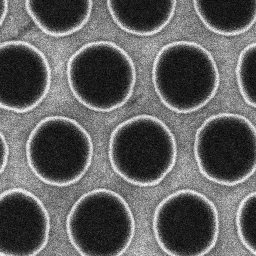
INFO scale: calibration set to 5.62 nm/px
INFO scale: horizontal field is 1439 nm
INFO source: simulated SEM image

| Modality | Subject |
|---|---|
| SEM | raised bodies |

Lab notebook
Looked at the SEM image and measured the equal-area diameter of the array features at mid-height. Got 377 nm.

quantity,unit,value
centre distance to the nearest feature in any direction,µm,0.469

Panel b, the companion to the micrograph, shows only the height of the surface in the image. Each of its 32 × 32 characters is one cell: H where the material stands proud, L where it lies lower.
HLLHHHHHHHHLLHHHHHHHHHLLHHHHHHHH
HLLLHHHHHHHLLLHHHHHHHHLLLHHHHHHH
LLLLHHHHHHHLLLHHHHHHHLLLLHHHHHHH
LLLLLHHHHHLLLLLHHHHHLLLLLLHHHHHL
LLLLLLLLLLLLLLLLLLLLLLLLLLLLLLLL
LHHLLLLLLLLHHHLLLLLLLLHHLLLLLLLL
HHHHHLLLLLHHHHHLLLLLHHHHHHLLLLHH
HHHHHHLLLHHHHHHHLLLLHHHHHHHLLLHH
HHHHHHLLLHHHHHHHHLLHHHHHHHHLLLHH
HHHHHHLLLHHHHHHHHLLHHHHHHHHLLLHH
HHHHHHLLLHHHHHHHHLLHHHHHHHHLLLHH
HHHHHHLLLHHHHHHHLLLLHHHHHHHLLLHH
HHHHHLLLLLHHHHHHLLLLHHHHHHLLLLLH
LHHHLLLLLLLHHHLLLLLLLHHHHLLLLLLL
LLLLLLLLLLLLLLLLLLLLLLLLLLLHHHLL
LLLLLHHHHHLLLLLHHHHHLLLLLLHHHHHL
LLLLHHHHHHHLLLHHHHHHHLLLLHHHHHHH
HLLLHHHHHHHLLLHHHHHHHHLLLHHHHHHH
HLLLHHHHHHHLLLHHHHHHHHLLHHHHHHHH
HLLLHHHHHHHLLLHHHHHHHHLLLHHHHHHH
HLLLHHHHHHHLLLHHHHHHHHLLLHHHHHHH
LLLLHHHHHHHLLLLHHHHHHLLLLHHHHHHH
LLLLLHHHHLLLLLLLHHHHLLLLLLLHHHLL
LLLLLLLLLLLLLLLLLLLLLLLLLLLLLLLL
HHHHLLLLLLHHHHHLLLLLLHHHHLLLLLLH
HHHHHLLLLHHHHHHHLLLLHHHHHHLLLLHH
HHHHHHLLLHHHHHHHLLLLHHHHHHHLLLHH
HHHHHHLLLHHHHHHHHLLHHHHHHHHLLLHH
HHHHHHLLHHHHHHHHHLLHHHHHHHHLLLHH
HHHHHHLLLHHHHHHHHLLLHHHHHHHLLLHH
HHHHHHLLLHHHHHHHLLLLHHHHHHHLLLLH
HHHHHLLLLLHHHHHLLLLLLHHHHHLLLLLL